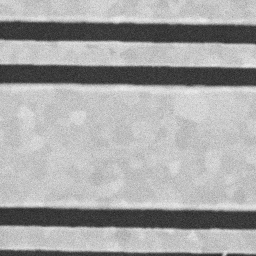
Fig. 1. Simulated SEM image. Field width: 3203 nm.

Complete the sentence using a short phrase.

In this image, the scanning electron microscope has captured lines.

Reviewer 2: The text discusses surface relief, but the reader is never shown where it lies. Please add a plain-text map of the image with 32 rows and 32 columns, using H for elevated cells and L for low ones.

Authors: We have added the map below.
HHHHHHHHHHHHHHHHHHHHHHHHHHHHHHHH
HHHHHHHHHHHHHHHHHHHHHHHHHHHHHHHH
HHHHHHHHHHHHHHHHHHHHHHHHHHHHHHHH
LLLLLLLLLLLLLLLLLLLLLLLLLLLLLLLL
LLLLLLLLLLLLLLLLLLLLLLLLLLLLLLLL
HHHHHHHHHHHHHHHHHHHHHHHHLHHHLLLL
HHHHHHHHHHHHHHHHHHHHHHHHHHHHHHHH
HHHHHHHHHHHHHHHHHHHHHHHHHHHHHHHH
LLLLLLLLLLLLLLLLLLLLLLLLLLLLLLLL
LLLLLLLLLLLLLLLLLLLLLLLLLLLLLLLL
LLLLLLLLLLLLLLLLLLLLLLLLLLLLLLLL
HHHHHHHHHHHHHHHHHHHHHHHHHHHHHHHH
HHHHHHHHHHHHHHHHHHHHHHHHHHHHHHHH
HHHHHHHHHHHHHHHHHHHHHHHHHHHHHHHH
HHHHHHHHHHHHHHHHHHHHHHHHHHHHHHHH
HHHHHHHHHHHHHHHHHHHHHHHHHHHHHHHH
HHHHHHHHHHHHHHHHHHHHHHHHHHHHHHHH
HHHHHHHHHHHHHHHHHHHHHHHHHHHHHHHH
HHHHHHHHHHHHHHHHHHHHHHHHHHHHHHHH
HHHHHHHHHHHHHHHHHHHHHHHHHHHHHHHH
HHHHHHHHHHHHHHHHHHHHHHHHHHHHHHHH
HHHHHHHHHHHHHHHHHHHHHHHHHHHHHHHH
HHHHHHHHHHHHHHHHHHHHHHHHHHHHHHHH
HHHHHHHHHHHHHHHHHHHHHHHHHHHHHHHH
HHHHHHHHHHHHHHHHHHHHHHHHHHHHHHHH
HHHHHHHHHHHHHHHHHHHHHHHHHHHHHHHH
LLLLLLLLLLLLLLLLLLLLLLLLLLLLLLLL
LLLLLLLLLLLLLLLLLLLLLLLLLLLLLLLL
HHHHHHHHHLHLLLLLLLLLLLLLLLLLLLLL
HHHHHHHHHHHHHHHHHHHHHHHHHHHHHHHH
HHHHHHHHHHHHHHHHHHHHHHHHHHHHHHHH
LLLLLLLLLLLLLLLLLLLLLLLLHHHHHHHH